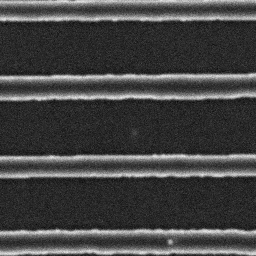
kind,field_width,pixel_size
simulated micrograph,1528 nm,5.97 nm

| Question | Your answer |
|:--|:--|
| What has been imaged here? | lines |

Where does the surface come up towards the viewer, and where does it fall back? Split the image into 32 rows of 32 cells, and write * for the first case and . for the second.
********************************
********************************
*********.***.*..****.**........
................................
................................
................................
................................
................................
................................
.............*.**...************
********************************
********************************
................................
................................
................................
................................
................................
................................
................................
...................******...****
********************************
********************************
................................
................................
................................
................................
................................
................................
................................
********************************
********************************
********************************